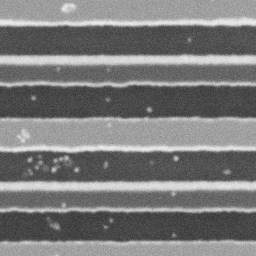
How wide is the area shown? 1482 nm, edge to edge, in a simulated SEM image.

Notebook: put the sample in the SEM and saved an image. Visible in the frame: lines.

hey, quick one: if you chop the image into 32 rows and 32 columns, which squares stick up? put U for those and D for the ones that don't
UUUUUUUUUUUUUUUUUUUUUUUUUUUUUUUU
UUUUUUUUUUUUUUUUUUUUUUUUUUUUUUUU
UUUUUUUUUUUUUUUUUUUUUUUUUUUUUUUU
DDDDDDDDDDDDDDDDDDDDDDDDDDDDDDDD
DDDDDDDDDDDDDDDDDDDDDDDDDDDDDDDD
DDDDDDDDDDDDDDDDDDDDDDDDDDDDDDDD
DDDDDDDDDDDDDDDDDDDDDDDDDDDDDDDD
UUUUUUUUUUUUUUUUUUUUUUUUUUUUUUUU
UUUUUUUUUUUUUUUUUUUUUUUUUUUUUUUU
UUUUUUUUUUUUUUUUUUUUUUUUUUUUUUUU
UUUUUUUUUUUUUUUUUUUUUUUUUUUUUUUU
DDDDDDDDDDDDDDDDDDDDDDDDDDDDDDDD
DDDDDDDDDDDDDDDDDDDDDDDDDDDDDDDD
DDDDDDDDDDDDDDDDDDDDDDDDDDDDDDDD
DDDDDDDDDDDDDDDDDDDDDDDDDDDDDDDD
UUUUUUUUUUUUUUUUUUUUUUUUUUUUUUUU
UUUUUUUUUUUUUUUUUUUUUUUUUUUUUUUU
UUUUUUUUUUUUUUUUUUUUUUUUUUUUUUUU
UUUUUUUUUUUUUUUUUUUUUUUUUUUUUUUU
DDDDDDDDDDDDDDDDDDDDDDDDDDDDDDDD
DDDDDDDDDDDDDDDDDDDDDDDDDDDDDDDD
DDDDDDDDDDDDDDDDDDDDDDDDDDDDDDDD
DDDDDDDDDDDDDDDDDDDDDDDDDDDDDDDD
UUUUUUUUUUUUUUUUUUUUUUUUUUUUUUUU
UUUUUUUUUUUUUUUUUUUUUUUUUUUUUUUU
UUUUUUUUUUUUUUUUUUUUUUUUUUUUUUUU
DDDDDDDDDDDDDDDDDDDDDDDDDDDDDDDD
DDDDDDDDDDDDDDDDDDDDDDDDDDDDDDDD
DDDDDDDDDDDDDDDDDDDDDDDDDDDDDDDD
DDDDDDDDDDDDDDDDDDDDDDDDDDDDDDDD
UUUUUUUUUUUUUUUUUUUUUUUUUUUUUUUU
UUUUUUUUUUUUUUUUUUUUUUUUUUUUUUUU